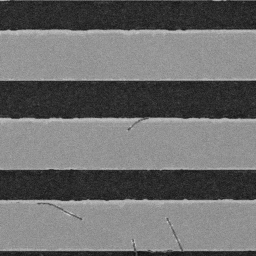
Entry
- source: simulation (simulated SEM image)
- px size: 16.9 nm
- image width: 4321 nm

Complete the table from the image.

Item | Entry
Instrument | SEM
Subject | lines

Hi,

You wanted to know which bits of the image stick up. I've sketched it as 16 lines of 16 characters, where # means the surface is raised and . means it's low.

................
................
################
################
################
................
................
################
################
################
################
................
................
################
################
################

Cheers